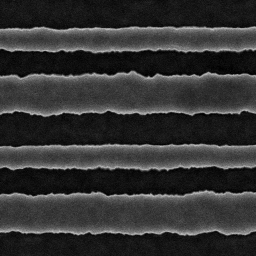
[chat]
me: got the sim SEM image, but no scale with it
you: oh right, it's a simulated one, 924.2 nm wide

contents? lines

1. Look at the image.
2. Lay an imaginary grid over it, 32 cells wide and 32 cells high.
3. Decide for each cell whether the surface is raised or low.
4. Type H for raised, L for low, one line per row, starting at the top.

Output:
LLLLLLLLLLLLLLLLLLLLLLLLLLLLLLLL
LLLLLLLLLLLLLLLLLLLLLLLLLLLLLLLL
LLLLLLLLLLLLLLLLLLLLLLLLLLLLLLLL
LLLLHHLLLLLHLLLLHHHHHHHHHHLHHLLH
HHHHHHHHHHHHHHHHHHHHHHHHHHHHHHHH
HHHHHHHHHHHHHHHHHHHHHHHHHHHHHHHH
LLLLLLLLLLLLHLLLLLLLLLLLLLLLLLLL
LLLLLLLLLLLLLLLLLLLLLLLLLLLLLLLL
LLLLLLLLLLLLLLLLLLLLLLLLLLLLLLLL
LHLHHHHHLLHHHHHHHHLHHHHHHHHHHHHH
HHHHHHHHHHHHHHHHHHHHHHHHHHHHHHHH
HHHHHHHHHHHHHHHHHHHHHHHHHHHHHHHH
HHHHHHHHHHHHHHHHHHHHHHHHHHHHHHHH
HHHHHHHHHHHHHHHHHHHHHHHHHHHHHHHH
LLLLLLLLLLLLLLLLLLLLLLLLLLLLLLLL
LLLLLLLLLLLLLLLLLLLLLLLLLLLLLLLL
LLLLLLLLLLLLLLLLLLLLLLLLLLLLLLLL
LLLLLLLLLLLLLLLLLLLLLLLLLLLLLLLL
HHHHHHHHHHHHHHHHHHHHHHHHHHHHHHHH
HHHHHHHHHHHHHHHHHHHHHHHHHHHHHHHH
HHHHHHHHHHHHHHHHHHHHHHHHHHHHHHHH
LLLLLLLLLLLLLLLLLLLLLLLLLLLLLLLL
LLLLLLLLLLLLLLLLLLLLLLLLLLLLLLLL
LLLLLLLLLLLLLLLLLLLLLLLLLLLLLLLL
HHHHHHHHHHHHHHHHHHHHHHHHHHHHHHHH
HHHHHHHHHHHHHHHHHHHHHHHHHHHHHHHH
HHHHHHHHHHHHHHHHHHHHHHHHHHHHHHHH
HHHHHHHHHHHHHHHHHHHHHHHHHHHHHHHH
HHHHHHHHHHHHHHHHHHHHHHHHHHHHHHHH
LLLLLLLLLLLLLLLLLLLLLLLLLLLLLLLL
LLLLLLLLLLLLLLLLLLLLLLLLLLLLLLLL
LLLLLLLLLLLLLLLLLLLLLLLLLLLLLLLL